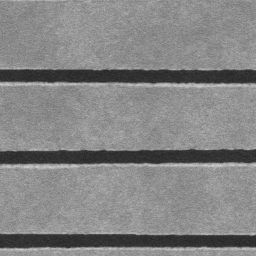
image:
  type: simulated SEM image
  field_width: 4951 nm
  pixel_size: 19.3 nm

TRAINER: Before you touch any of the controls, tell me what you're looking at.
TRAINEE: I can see lines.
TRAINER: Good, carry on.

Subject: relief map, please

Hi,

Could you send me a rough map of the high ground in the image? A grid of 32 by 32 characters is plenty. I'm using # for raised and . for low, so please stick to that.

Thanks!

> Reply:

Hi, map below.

################################
################################
################################
################################
################################
################################
################################
################################
################################
................................
#..##...........................
################################
################################
################################
################################
################################
################################
################################
################################
................................
................................
################################
################################
################################
################################
################################
################################
################################
################################
................................
................................
################################